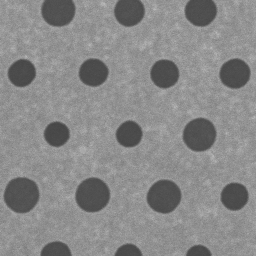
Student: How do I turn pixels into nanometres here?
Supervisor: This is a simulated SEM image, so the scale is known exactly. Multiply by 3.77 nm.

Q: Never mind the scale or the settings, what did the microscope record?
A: a regular array of holes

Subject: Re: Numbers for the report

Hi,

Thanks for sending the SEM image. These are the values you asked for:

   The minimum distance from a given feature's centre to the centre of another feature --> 265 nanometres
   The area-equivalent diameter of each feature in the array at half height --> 109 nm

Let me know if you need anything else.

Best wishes